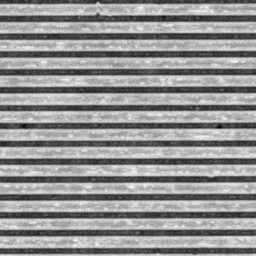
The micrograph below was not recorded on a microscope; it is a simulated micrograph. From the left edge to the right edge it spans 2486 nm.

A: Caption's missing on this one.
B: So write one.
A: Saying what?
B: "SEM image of parallel lines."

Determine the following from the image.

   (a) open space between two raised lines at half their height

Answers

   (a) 81.3 nm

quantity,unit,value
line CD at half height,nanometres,91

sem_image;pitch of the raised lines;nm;174